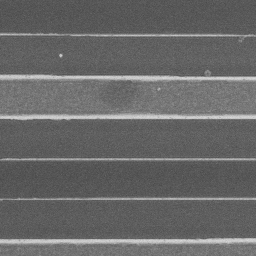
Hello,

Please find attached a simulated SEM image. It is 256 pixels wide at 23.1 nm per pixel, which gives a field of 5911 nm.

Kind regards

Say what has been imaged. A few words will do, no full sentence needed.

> lines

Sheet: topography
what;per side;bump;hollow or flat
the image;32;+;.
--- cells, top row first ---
++++++++++++++++++++++++++++++++
++++++++++++++++++++++++++++++++
++++++++++++++++++++++++++++++++
++++++++++++++++++++++++++++++++
................................
................................
................................
................................
................................
+...............................
++++++++++++++++++++++++++++++++
++++++++++++++++++++++++++++++++
++++++++++++++++++++++++++++++++
++++++++++++++++++++++++++++++++
++++++++++++++++++++++++++++++++
................................
................................
................................
................................
................................
++++++++++++++++++++++++++++++++
++++++++++++++++++++++++++++++++
++++++++++++++++++++++++++++++++
++++++++++++++++++++++++++++++++
++++++++++++++++++++++++++++++++
................................
................................
................................
................................
................................
++++++++++++++++++++++++++++++++
++++++++++++++++++++++++++++++++